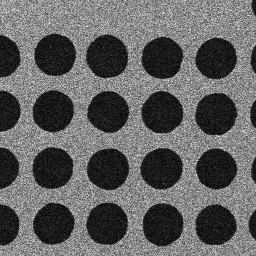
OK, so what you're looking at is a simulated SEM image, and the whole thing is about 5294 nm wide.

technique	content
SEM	a regular array of holes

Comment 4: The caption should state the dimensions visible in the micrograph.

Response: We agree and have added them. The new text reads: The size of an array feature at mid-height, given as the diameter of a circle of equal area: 0.866 um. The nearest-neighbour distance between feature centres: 1110 nm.